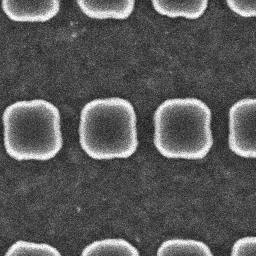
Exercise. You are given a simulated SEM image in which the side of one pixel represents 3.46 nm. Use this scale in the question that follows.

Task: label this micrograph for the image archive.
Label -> raised bodies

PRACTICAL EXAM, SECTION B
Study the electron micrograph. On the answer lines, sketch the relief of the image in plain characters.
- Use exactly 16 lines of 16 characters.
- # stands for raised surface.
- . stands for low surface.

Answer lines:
####.###..###..#
................
................
................
................
................
.##...##..##...#
####.###..###.##
####.###..###.##
.##...##..###..#
................
................
................
................
................
.##...##..###..#